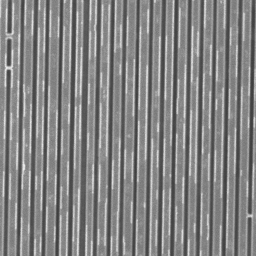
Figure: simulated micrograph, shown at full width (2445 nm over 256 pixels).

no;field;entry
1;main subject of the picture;parallel lines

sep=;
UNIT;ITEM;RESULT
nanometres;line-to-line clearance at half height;44.1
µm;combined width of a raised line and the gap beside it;0.122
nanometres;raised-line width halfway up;79.9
